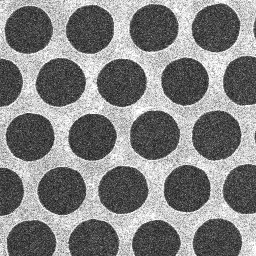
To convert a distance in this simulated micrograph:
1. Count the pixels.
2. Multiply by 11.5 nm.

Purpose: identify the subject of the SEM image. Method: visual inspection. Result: a regular array of holes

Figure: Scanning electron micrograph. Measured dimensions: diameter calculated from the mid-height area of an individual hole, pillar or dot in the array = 49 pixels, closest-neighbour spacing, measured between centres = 701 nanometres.